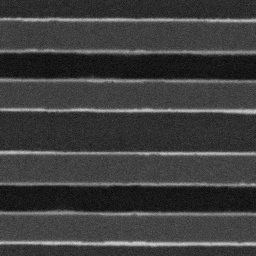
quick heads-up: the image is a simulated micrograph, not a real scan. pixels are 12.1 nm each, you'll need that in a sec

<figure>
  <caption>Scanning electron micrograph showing lines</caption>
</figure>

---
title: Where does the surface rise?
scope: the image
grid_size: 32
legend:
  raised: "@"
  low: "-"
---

--------------------------------
--------------------------------
@@@@@@@@@@@@@@@@@@@@@@@@@-------
@@@@@@@@@@@@@@@@@@@@@@@@@@@@@@@@
@@@@@@@@@@@@@@@@@@@@@@@@@@@@@@@@
@@@@@@@@@@@@@@@@@@@@@@@@@@@@@@@@
--------------------------------
--------------------------------
--------------------------------
--------------------------------
@@@@@@@@@@@@@@@@@@@@@@@@@@@@@@@@
@@@@@@@@@@@@@@@@@@@@@@@@@@@@@@@@
@@@@@@@@@@@@@@@@@@@@@@@@@@@@@@@@
@@@@@@@@@@@@@@@@@@@@@@@@@@@@@@@@
--------------------------------
--------------------------------
--------------------------------
--------------------------------
--------------------------------
@@@@@@@@@@@@@@@@@@@@@@@@@@@@@@@@
@@@@@@@@@@@@@@@@@@@@@@@@@@@@@@@@
@@@@@@@@@@@@@@@@@@@@@@@@@@@@@@@@
@@@@@@@@@@@@@@@@@@@@@@@@@@@@@@@@
--------------------------------
--------------------------------
--------------------------------
--------------------------------
@@@@@@@@@@@@@@@@@@@@@@@@@@@@@@@@
@@@@@@@@@@@@@@@@@@@@@@@@@@@@@@@@
@@@@@@@@@@@@@@@@@@@@@@@@@@@@@@@@
------------------------------@-
--------------------------------